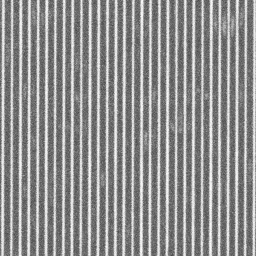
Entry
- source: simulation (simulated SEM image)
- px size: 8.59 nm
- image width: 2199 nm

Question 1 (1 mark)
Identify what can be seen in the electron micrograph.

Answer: parallel lines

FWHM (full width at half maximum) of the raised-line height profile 2.25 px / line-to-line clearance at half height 6.87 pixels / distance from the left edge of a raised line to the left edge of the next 0.0744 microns